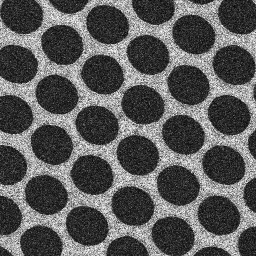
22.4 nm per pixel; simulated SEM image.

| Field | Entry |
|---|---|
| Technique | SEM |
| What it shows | a regular array of holes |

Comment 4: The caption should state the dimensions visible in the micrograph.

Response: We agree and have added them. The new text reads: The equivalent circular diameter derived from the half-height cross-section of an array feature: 926 nm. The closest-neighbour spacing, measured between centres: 1120 nanometers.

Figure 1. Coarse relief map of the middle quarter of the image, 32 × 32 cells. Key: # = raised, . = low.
#####.........###.........###...
####...........###.......##.....
####...........#####...###......
.###...........###########......
..###..........###########......
...###........###....#####......
...####......###.......###......
...######...###.........###.....
....###########..........##.....
....##########...........####...
...###....####...........#######
..##.......####..........#######
####........###..........#######
###..........###........##......
###...........###......##.......
###...........###########.......
###...........##########........
.###.........###########........
..###........##......####.......
..####......##........###.......
..###########..........###......
..###########..........####.....
..###########...........#####...
.###.....####...........########
###........###..........########
##..........##.........###...###
##..........###........##......#
##..........####.....###........
##..........###########.........
##..........###########.........
###.........###########.........
.###.......###......###.........